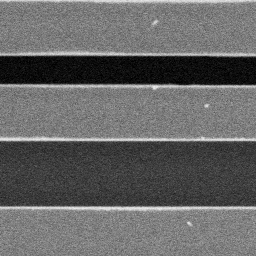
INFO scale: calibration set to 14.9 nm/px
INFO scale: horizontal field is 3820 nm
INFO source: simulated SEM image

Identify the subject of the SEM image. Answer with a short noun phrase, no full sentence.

lines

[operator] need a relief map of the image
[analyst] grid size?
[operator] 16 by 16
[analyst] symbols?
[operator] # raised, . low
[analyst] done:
################
################
################
...............#
................
################
################
################
################
................
................
................
................
################
################
################